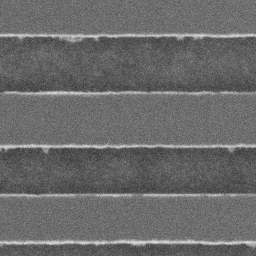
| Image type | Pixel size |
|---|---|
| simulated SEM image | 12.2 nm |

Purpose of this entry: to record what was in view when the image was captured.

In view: lines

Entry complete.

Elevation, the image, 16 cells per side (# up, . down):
################
################
................
................
................
................
################
################
################
................
................
................
################
################
################
................